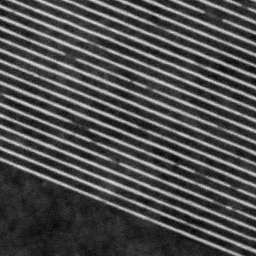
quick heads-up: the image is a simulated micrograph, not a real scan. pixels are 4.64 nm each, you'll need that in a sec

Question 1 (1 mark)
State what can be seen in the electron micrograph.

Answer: parallel lines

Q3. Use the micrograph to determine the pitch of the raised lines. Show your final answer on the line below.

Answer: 10.1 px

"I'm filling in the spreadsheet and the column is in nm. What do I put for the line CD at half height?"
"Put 9.7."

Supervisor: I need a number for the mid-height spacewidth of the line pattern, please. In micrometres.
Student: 0.0387